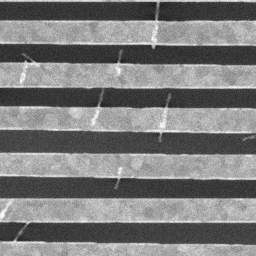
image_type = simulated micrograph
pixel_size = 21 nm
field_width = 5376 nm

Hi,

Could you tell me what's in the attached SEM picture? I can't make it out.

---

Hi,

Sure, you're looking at lines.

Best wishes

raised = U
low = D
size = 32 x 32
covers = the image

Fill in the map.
DDDDDDDDDDDDDDDDDDDDDDDDDDDDDDDD
DDDDDDDDDDDDDDDDDDDDDDDDDDDDDDDD
DDDDDDDDDDDDDDDDDDDDDDDDDDDDDDDD
UUUUUUUUUUUUUUUUUUUUUUUUUUUUUUUU
UUUUUUUUUUUUUUUUUUUUUUUUUUUUUUUU
DDDDDDDDDDDDDDDDDDDUUUUUUUUUUUUU
DDDDDDDDDDDDDDDDDDDDDDDDDDDDDDDD
DDDDDDDDDDDDDDDDDDDDDDDDDDDDDDDD
UUUUUUUUUUUUUUUUUUUUUUUUUUUUUUUU
UUUUUUUUUUUUUUUUUUUUUUUUUUUUUUUU
UUUUUUUUUUUUUUUUUUUUUUUUUUUUUUUU
DDDDDDDDDDDDDDDDDDDDDDDDDDDDDDDD
DDDDDDDDDDDDDDDDDDDDDDDDDDDDDDDD
UUUUUUUDDDDDUDDDDDDDUDDDDDDDDDDD
UUUUUUUUUUUUUUUUUUUUUUUUUUUUUUUU
UUUUUUUUUUUUUUUUUUUUUUUUUUUUUUUU
DDDDDDDDDDDDDDDDDDDDUDDUUUUUUUUU
DDDDDDDDDDDDDDDDDDDDDDDDDDDDDDDD
DDDDDDDDDDDDDDDDDDDDDDDDDDDDDDDD
UUUUUUUUUUUUUUUUUUUUUUUUUUUUUUUU
UUUUUUUUUUUUUUUUUUUUUUUUUUUUUUUU
UUUUUUUUUUUUUUUUUUUUUUUUUUUUUUUU
DDDDDDDDDDDDDDDDDDDDDDDDDDDDDDDD
DDDDDDDDDDDDDDDDDDDDDDDDDDDDDDDD
DDDDDDDDDDDDDDDDDDDDDDDDDDDDDDDD
UUUUUUUUUUUUUUUUUUUUUUUUUUUUUUUU
UUUUUUUUUUUUUUUUUUUUUUUUUUUUUUUU
UUUUUUUUUUUUUUUUUUUUUUUUUUUUUUUU
DDDDDDDDDDDDDDDDDDDDDDDDDDDDDDDD
DDDDDDDDDDDDDDDDDDDDDDDDDDDDDDDD
UUUUUUUUUUUUUUUUUUUUDDDDDDDDDDDD
UUUUUUUUUUUUUUUUUUUUUUUUUUUUUUUU